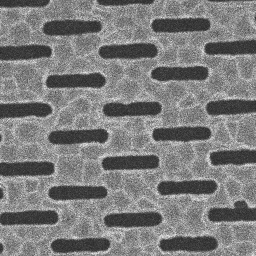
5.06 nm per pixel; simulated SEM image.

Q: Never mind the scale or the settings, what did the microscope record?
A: a regular array of holes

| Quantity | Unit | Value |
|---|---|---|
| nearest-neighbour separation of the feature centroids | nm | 271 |